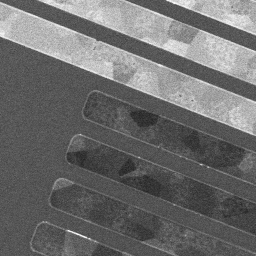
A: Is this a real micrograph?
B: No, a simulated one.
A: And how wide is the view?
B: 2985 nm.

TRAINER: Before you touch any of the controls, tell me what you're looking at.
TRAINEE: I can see parallel lines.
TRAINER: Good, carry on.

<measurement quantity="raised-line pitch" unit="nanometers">546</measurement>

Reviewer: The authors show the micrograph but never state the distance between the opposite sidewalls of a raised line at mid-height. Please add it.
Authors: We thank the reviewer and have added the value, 352 nm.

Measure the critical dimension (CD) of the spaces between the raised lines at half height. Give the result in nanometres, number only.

192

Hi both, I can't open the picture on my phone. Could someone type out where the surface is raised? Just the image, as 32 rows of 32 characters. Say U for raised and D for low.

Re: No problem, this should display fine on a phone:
DDDDDDUUUUUUUUUUDDDDDDUUUUUUUUUU
UUUDDDDDDUUUUUUUUUUDDDDDDUUUUUUU
UUUUUUDDDDDUUUUUUUUUUUDDDDDUUUUU
UUUUUUUUDDDDDDUUUUUUUUUUDDDDDDUU
UUUUUUUUUUUDDDDDUUUUUUUUUUDDDDDD
DDDUUUUUUUUUUDDDDDDUUUUUUUUUUDDD
DDDDDUUUUUUUUUUUDDDDDDUUUUUUUUUU
DDDDDDDDUUUUUUUUUUDDDDDDUUUUUUUU
DDDDDDDDDDDUUUUUUUUUUDDDDDDUUUUU
DDDDDDDDDDDDDUUUUUUUUUUUDDDDDUUU
DDDDDDDDDDDDDDDDUUUUUUUUUUDDDDDD
DDDDDDDDDDDDDDDDDDUUUUUUUUUUUDDD
DDDDDDDDDDDUUUUDDDDDDUUUUUUUUUUD
DDDDDDDDDDDUUUUUUDDDDDDUUUUUUUUU
DDDDDDDDDDUUUUUUUUUUDDDDDDUUUUUU
DDDDDDDDDDDDUUUUUUUUUUUDDDDDDUUU
DDDDDDDDDDDDDDDUUUUUUUUUUDDDDDDU
DDDDDDDDDUUUDDDDDUUUUUUUUUUUDDDD
DDDDDDDDDUUUUUDDDDDDUUUUUUUUUUDD
DDDDDDDDUUUUUUUUUDDDDDDUUUUUUUUU
DDDDDDDDDUUUUUUUUUUDDDDDDUUUUUUU
DDDDDDDDDDDUUUUUUUUUUUDDDDDDUUUU
DDDDDDDUDDDDDDUUUUUUUUUUUDDDDDUU
DDDDDDDUUUUDDDDDUUUUUUUUUUUDDDDD
DDDDDDUUUUUUUDDDDDDUUUUUUUUUUUDD
DDDDDDUUUUUUUUUUDDDDDDUUUUUUUUUU
DDDDDDDDUUUUUUUUUUDDDDDDUUUUUUUU
DDDDDDDDDDDUUUUUUUUUUDDDDDDUUUUU
DDDDDUUUDDDDDUUUUUUUUUUDDDDDDUUU
DDDDUUUUUUDDDDDDUUUUUUUDUUDDDDDD
DDDDUUUUUUUUUDDDDDUUUUUUUUUUUDDD
DDDDDUUUUUUUUUUDDDDDDUUUUUUUUUUD